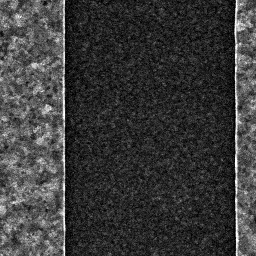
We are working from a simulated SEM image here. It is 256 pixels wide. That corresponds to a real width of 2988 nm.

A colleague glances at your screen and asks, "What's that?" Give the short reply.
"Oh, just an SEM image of one or a few lines or trenches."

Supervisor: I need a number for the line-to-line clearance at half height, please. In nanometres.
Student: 2000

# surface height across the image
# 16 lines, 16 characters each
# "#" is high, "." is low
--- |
####...........#
####...........#
####...........#
####...........#
####...........#
####...........#
####...........#
####...........#
####...........#
####...........#
####...........#
####...........#
####...........#
####...........#
####...........#
####...........#